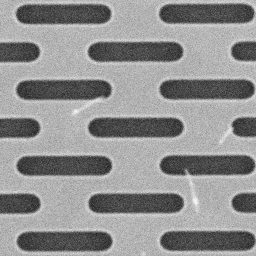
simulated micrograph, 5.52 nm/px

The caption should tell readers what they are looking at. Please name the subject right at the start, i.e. groups of lines, slits or small figures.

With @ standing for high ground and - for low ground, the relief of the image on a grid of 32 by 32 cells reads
@@@----------@@@@@@@@----------@
@@------------@@@@@@------------
@@------------@@@@@@------------
@@@@@@@@@@@@@@@@@@@@@@@@@@@@@@@@
@@@@@@@@@@@@@@@@@@@@@@@@@@@@@@@@
-----@@@@@@-----------@@@@@@@---
-----@@@@@@------------@@@@@@---
----@@@@@@@-----------@@@@@@@---
@@@@@@@@@@@@@@@@@@@@@@@@@@@@@@@@
@@@@@@@@@@@@@@@@@@@@@@@@@@@@@@@@
@@------------@@@@@@------------
@@------------@@@@@@------------
@@@----------@@@@@@@@----------@
@@@@@@@@@@@@@@@@@@@@@@@@@@@@@@@@
@@@@@@@@@@@@@@@@@--@@@@@@@@@@@--
-----@@@@@@------------@@@@@@---
-----@@@@@@------------@@@@@@---
@@@@@@@@@@@@@@@@@@@@@@@@@@@@@@@@
@@@@@@@@@@@@@@@@@@@@@@@@@@@@@@@@
@@@----------@@@@@@@@----------@
@@------------@@@@@@------------
@@------------@@@@@@------------
@@@@@@@@@@@@@@@@@@@@@@@@@@@@@@@@
@@@@@@@@@@@@@@@@@@@@@@@@@@@@@@@@
-----@@@@@@------------@@@@@@---
-----@@@@@@------------@@@@@@---
-----@@@@@@@----------@@@@@@@@--
@@@@@@@@@@@@@@@@@@@@@@@@@@@@@@@@
@@@@@@@@@@@@@@@@@@@@@@@@@@@@@@@@
@@------------@@@@@@------------
@@------------@@@@@@------------
@@@----------@@@@@@@@@--------@@